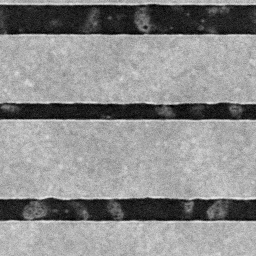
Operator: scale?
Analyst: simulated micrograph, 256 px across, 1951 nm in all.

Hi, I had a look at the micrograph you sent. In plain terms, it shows one or a few lines or trenches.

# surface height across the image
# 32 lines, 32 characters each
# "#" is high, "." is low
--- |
############..####..###.########
................................
................................
................................
################################
################################
################################
################################
################################
################################
################################
################################
################################
................................
................................
################################
################################
################################
################################
################################
################################
################################
################################
################################
################################
................................
................................
................................
################################
################################
################################
################################